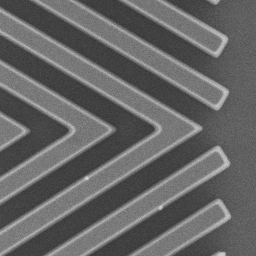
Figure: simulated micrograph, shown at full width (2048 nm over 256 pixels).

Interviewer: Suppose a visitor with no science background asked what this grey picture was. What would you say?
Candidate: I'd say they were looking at groups of lines, slits or small figures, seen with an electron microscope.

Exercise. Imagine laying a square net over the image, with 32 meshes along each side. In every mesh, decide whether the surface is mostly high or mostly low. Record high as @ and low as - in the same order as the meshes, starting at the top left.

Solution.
-----@@@@@------@@@@@-----------
@------@@@@@------@@@@@---------
@@------@@@@@------@@@@@--------
@@@@------@@@@@------@@@@@------
-@@@@@------@@@@@------@@@@@----
--@@@@@@-----@@@@@@-----@@@@----
----@@@@@------@@@@@------@-----
------@@@@@------@@@@@----------
@@-----@@@@@@-----@@@@@@--------
@@@------@@@@@------@@@@@-------
@@@@@------@@@@@------@@@@@-----
-@@@@@@-----@@@@@@-----@@@@@----
---@@@@@------@@@@@------@@@----
-----@@@@@------@@@@@-----------
@-----@@@@@@-----@@@@@@---------
@@------@@@@@------@@@@@--------
@@@------@@@@@-----@@@@@--------
@@-----@@@@@------@@@@@---------
------@@@@@-----@@@@@-----------
----@@@@@------@@@@@-----@@@----
---@@@@@-----@@@@@------@@@@----
-@@@@@------@@@@@-----@@@@@-----
@@@@@-----@@@@@------@@@@@------
@@@------@@@@@-----@@@@@--------
@------@@@@@-----@@@@@----------
-----@@@@@------@@@@@-----@@----
----@@@@@-----@@@@@------@@@----
--@@@@@------@@@@@-----@@@@@----
-@@@@@-----@@@@@------@@@@@-----
@@@@------@@@@@-----@@@@@-------
@@@-----@@@@@------@@@@@--------
@-----@@@@@------@@@@@----------